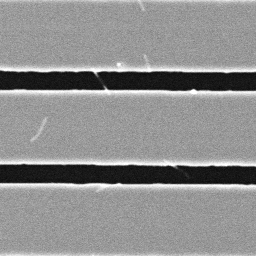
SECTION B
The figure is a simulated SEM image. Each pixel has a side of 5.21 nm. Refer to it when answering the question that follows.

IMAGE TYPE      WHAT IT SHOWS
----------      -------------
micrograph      lines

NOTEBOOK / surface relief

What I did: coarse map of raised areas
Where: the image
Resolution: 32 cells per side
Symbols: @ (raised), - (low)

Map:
@@@@@@@@@@@@@@@@@@@@@@@@@@@@@@@@
@@@@@@@@@@@@@@@@@@@@@@@@@@@@@@@@
@@@@@@@@@@@@@@@@@@@@@@@@@@@@@@@@
@@@@@@@@@@@@@@@@@@@@@@@@@@@@@@@@
@@@@@@@@@@@@@@@@@@@@@@@@@@@@@@@@
@@@@@@@@@@@@@@@@@@@@@@@@@@@@@@@@
@@@@@@@@@@@@@@@@@@@@@@@@@@@@@@@@
@@@@@@@@@@@@@@@@@@@@@@@@@@@@@@@@
@@@@@@@@@@@@@@@@@@@@@@@@@@@@@@@@
--------------------------------
--------------------------------
@@@@@@@@@@@@@@@@@@@@@@@@@@@@@@@@
@@@@@@@@@@@@@@@@@@@@@@@@@@@@@@@@
@@@@@@@@@@@@@@@@@@@@@@@@@@@@@@@@
@@@@@@@@@@@@@@@@@@@@@@@@@@@@@@@@
@@@@@@@@@@@@@@@@@@@@@@@@@@@@@@@@
@@@@@@@@@@@@@@@@@@@@@@@@@@@@@@@@
@@@@@@@@@@@@@@@@@@@@@@@@@@@@@@@@
@@@@@@@@@@@@@@@@@@@@@@@@@@@@@@@@
@@@@@@@@@@@@@@@@@@@@@@@@@@@@@@@@
-------@---@@@@@@@@@@@@@@@@@@@@@
--------------------------------
--------------------------------
@@@@@@@@@@@@@@@@@@@@@@@@@@@@@@@@
@@@@@@@@@@@@@@@@@@@@@@@@@@@@@@@@
@@@@@@@@@@@@@@@@@@@@@@@@@@@@@@@@
@@@@@@@@@@@@@@@@@@@@@@@@@@@@@@@@
@@@@@@@@@@@@@@@@@@@@@@@@@@@@@@@@
@@@@@@@@@@@@@@@@@@@@@@@@@@@@@@@@
@@@@@@@@@@@@@@@@@@@@@@@@@@@@@@@@
@@@@@@@@@@@@@@@@@@@@@@@@@@@@@@@@
@@@@@@@@@@@@@@@@@@@@@@@@@@@@@@@@